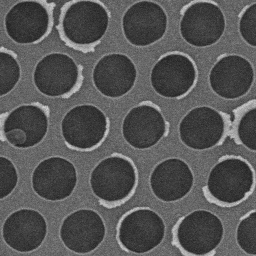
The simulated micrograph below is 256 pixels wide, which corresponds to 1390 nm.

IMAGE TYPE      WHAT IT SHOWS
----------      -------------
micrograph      a regular array of holes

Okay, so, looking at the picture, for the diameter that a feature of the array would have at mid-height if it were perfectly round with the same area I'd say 237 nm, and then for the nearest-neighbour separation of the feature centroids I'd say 318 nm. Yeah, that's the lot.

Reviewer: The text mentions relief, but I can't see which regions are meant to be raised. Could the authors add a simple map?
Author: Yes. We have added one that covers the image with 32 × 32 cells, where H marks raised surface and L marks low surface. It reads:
HHLLLHHHHLLLHHHHHLLLHHHHLLLHHHHH
HLLLLLHHLLLLLHHHLLLLLHHLLLLLHHHL
HLLLLLHHLLLLLHHLLLLLLHHLLLLLHHLL
HLLLLLHHLLLLLHHLLLLLLHHLLLLLHHLL
HLLLLHHHLLLLLHHHLLLLHHHLLLLLHHLL
HHHHHHHHHHLHHHHHHLLHHHHHLLLHHHHL
HHHHHHHHHHHHHHHHHHHHHHHHHHHHHHHH
LLHHHLLLLHHHHLLLHHHHLLLLHHHHLLLH
LLHHLLLLLLHHLLLLLHHLLLLLHHHLLLLL
LLHHLLLLLLHHLLLLLHHLLLLLHHLLLLLL
LLHHLLLLLHHHLLLLLHHLLLLLHHLLLLLH
LHHHHLLLHHHHHLLLHHHHLLLHHHHLLLLH
HHHHHHHHHHHHHHHHHHHHHHHHHHHHHHHH
HHLLLHHHHLLLHHHHHLLHHHHHHLHHHHHH
HLLLLLHHLLLLLHHHLLLLHHHLLLLLHHLL
HLLLLLHHLLLLLHHLLLLLLHHLLLLLHHLL
HLLLLLHHLLLLLHHLLLLLLHLLLLLLHHLL
HLLLLHHHLLLLLHHHLLLLHHHLLLLHHHLL
HHHHHHHHHHLHHHHHHLHHHHHHLLHHHHHL
HHHHHHHHHHHHHHHHHHHHHHHHHHHHHHHH
LLHHHLLLLHHHLLLLHHHHLLLHHHHLLLLH
LLHHLLLLLHHHLLLLLHHLLLLLHHLLLLLH
LLHHLLLLLLHLLLLLLHHLLLLLHHLLLLLL
LLHHLLLLLHHLLLLLLHHLLLLLHHLLLLLH
LHHHHLLLLHHHLLLLHHHHLLLHHHHLLLHH
HHHHHHHHHHHHHHHHHHHHHHHHHHHHHHHH
HHLLLHHHHLLLHHHHHLLHHHHHLLHHHHHH
HLLLLLHHLLLLLHHLLLLLHHHLLLLHHHLL
LLLLLLHHLLLLLHHLLLLLLHLLLLLLHHLL
LLLLLLHHLLLLLHHLLLLLHHLLLLLLHHLL
HLLLLHHHLLLLHHHLLLLLHHHLLLLHHHLL
HHHHHHHHHLLHHHHHHLHHHHHHLLHHHHHL